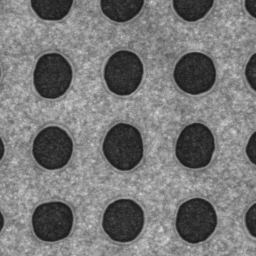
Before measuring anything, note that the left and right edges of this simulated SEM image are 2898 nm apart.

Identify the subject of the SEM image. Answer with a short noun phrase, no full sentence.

a regular array of holes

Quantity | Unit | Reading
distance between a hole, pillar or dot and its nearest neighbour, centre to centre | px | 71.2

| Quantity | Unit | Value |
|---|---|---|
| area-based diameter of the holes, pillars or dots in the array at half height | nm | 487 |